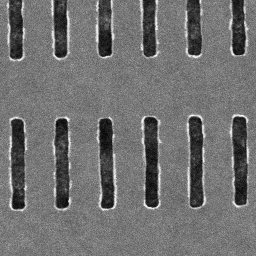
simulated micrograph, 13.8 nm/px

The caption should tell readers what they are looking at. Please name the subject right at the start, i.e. holes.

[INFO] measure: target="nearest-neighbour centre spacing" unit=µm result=0.608